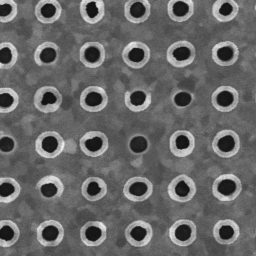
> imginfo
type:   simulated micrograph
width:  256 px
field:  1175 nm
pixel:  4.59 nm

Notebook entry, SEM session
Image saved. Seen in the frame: a regular array of holes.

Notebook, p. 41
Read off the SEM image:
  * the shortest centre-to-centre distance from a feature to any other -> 199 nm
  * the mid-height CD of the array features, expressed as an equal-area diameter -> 0.0745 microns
